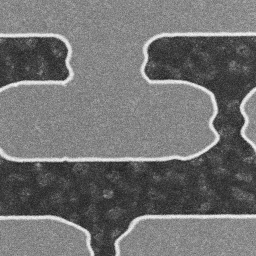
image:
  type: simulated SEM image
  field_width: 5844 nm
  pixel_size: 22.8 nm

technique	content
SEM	one or a few lines or trenches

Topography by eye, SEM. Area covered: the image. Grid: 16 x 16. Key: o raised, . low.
oooooooooooooooo
oooooooooooooooo
....oooooo......
....ooooo.......
....ooooo.......
ooooooooooooo...
ooooooooooooo..o
ooooooooooooo..o
ooooooooooooo..o
ooooooooooooo...
................
................
................
................
ooooo...oooooooo
oooooo.ooooooooo